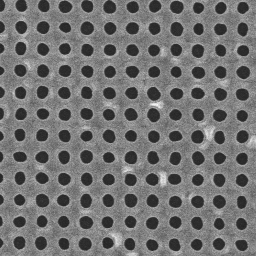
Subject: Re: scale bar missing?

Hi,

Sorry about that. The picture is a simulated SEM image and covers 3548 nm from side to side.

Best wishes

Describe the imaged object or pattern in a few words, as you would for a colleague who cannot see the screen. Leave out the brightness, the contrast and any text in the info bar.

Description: a regular array of holes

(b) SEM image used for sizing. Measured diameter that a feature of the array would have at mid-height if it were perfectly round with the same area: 0.171 µm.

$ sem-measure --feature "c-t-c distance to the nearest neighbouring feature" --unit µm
0.295